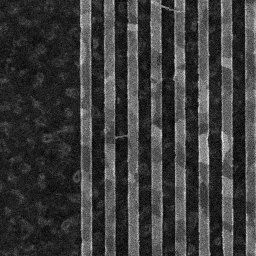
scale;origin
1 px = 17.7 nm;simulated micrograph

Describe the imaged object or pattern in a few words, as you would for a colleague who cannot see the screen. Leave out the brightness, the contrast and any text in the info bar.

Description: parallel lines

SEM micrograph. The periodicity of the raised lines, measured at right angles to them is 23.5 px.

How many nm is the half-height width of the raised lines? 168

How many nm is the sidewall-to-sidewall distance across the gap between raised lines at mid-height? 244